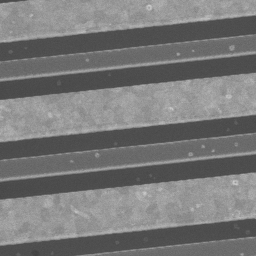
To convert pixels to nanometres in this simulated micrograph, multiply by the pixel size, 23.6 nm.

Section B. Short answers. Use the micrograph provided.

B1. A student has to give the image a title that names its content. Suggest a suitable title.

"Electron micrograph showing lines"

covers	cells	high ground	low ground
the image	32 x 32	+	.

++++++++++++++++++++++++++++++++
++++++++++++++++++++++++++++++++
+++++++++++++++++++++++++.......
++++++++++++++++................
+++++++........................+
....................++++++++++++
............++++++++++++++++++++
..++++++++++++++++++++++++......
++++++++++++++++................
++++++......................++++
....................++++++++++++
..........++++++++++++++++++++++
.+++++++++++++++++++++++++++++++
++++++++++++++++++++++++++++++++
++++++++++++++++++++++++++++++..
+++++++++++++++++++++...........
++++++++++......................
++......................++++++++
...............+++++++++++++++++
......+++++++++++++++++++++++...
++++++++++++++++++++............
+++++++++++.....................
+......................+++++++++
..............++++++++++++++++++
.....+++++++++++++++++++++++++++
++++++++++++++++++++++++++++++++
++++++++++++++++++++++++++++++++
+++++++++++++++++++++++++++++...
+++++++++++++++++++.............
++++++++++......................
+.......................++++++++
..............++++++++++++++++++